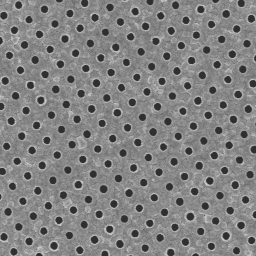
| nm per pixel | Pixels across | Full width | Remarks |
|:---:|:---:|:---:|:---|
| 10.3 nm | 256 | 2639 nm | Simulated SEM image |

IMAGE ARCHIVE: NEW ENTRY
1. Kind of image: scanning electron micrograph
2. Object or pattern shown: a regular array of holes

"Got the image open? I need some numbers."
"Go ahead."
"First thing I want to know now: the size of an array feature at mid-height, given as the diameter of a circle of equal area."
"0.0754 microns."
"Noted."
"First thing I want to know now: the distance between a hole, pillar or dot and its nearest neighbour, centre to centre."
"0.185 micrometres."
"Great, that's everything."